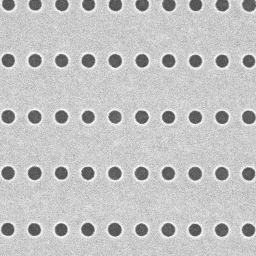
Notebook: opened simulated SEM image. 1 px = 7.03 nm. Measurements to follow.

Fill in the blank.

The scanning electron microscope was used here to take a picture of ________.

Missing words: a regular array of holes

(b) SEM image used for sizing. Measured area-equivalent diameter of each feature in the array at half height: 99 nm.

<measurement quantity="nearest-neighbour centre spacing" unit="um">0.187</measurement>